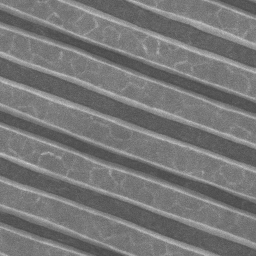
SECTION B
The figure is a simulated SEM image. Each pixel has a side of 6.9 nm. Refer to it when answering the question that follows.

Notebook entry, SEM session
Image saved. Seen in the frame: parallel lines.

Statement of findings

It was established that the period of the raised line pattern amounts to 323 nanometres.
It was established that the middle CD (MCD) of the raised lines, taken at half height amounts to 196 nanometers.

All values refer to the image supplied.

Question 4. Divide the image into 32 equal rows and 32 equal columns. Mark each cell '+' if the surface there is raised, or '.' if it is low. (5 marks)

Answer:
+++++++++........+++++++++++....
..++++++++++........++++++++++..
.....+++++++++.........+++++++++
+......++++++++++.........++++++
++++.....+++++++++++........++++
+++++++.....+++++++++++........+
++++++++++.....++++++++++.......
..+++++++++++.....++++++++++....
.....++++++++++.....+++++++++++.
........++++++++++.....+++++++++
++........+++++++++++.....++++++
+++++........++++++++++......+++
+++++++........+++++++++++......
++++++++++........+++++++++++...
...++++++++++........+++++++++++
.....++++++++++.........++++++++
+++.....++++++++++.........+++++
+++++......++++++++++........+++
++++++++.....+++++++++++........
+++++++++++.....+++++++++++.....
...++++++++++......+++++++++++..
.....++++++++++++.....++++++++++
........++++++++++++.....+++++++
+++........+++++++++++.....+++++
+++++++.......+++++++++++.....++
+++++++++........++++++++++.....
..++++++++++........++++++++++..
....+++++++++++........+++++++++
+......++++++++++.........++++++
++++......++++++++++........++++
+++++++.....+++++++++++........+
++++++++++.....++++++++++.......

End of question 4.